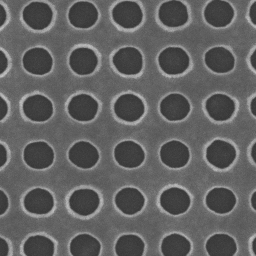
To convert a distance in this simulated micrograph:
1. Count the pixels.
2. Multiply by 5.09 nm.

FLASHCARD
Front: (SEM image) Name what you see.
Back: a regular array of holes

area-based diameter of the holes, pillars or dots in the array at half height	152	nanometres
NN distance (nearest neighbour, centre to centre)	231	nm